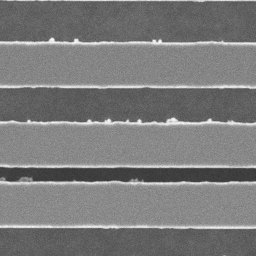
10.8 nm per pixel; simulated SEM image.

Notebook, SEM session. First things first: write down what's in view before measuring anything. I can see lines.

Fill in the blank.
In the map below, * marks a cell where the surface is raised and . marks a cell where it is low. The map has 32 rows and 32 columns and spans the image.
................................
................................
................................
................................
................................
********************************
********************************
********************************
********************************
********************************
********************************
................................
................................
................................
................................
********************************
********************************
********************************
********************************
********************************
********************************
................................
................................
********************************
********************************
********************************
********************************
********************************
.............**.....*.**********
................................
................................
................................